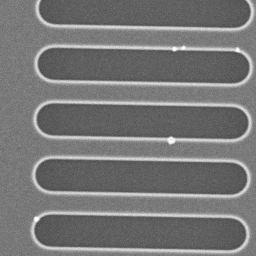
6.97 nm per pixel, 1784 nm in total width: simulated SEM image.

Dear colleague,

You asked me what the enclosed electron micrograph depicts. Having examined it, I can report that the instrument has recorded groups of lines, slits or small figures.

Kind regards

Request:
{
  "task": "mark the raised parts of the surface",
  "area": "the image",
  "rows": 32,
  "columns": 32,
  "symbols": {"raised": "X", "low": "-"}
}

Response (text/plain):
XXXXX--------------------------X
XXXXX--------------------------X
XXXXX--------------------------X
XXXXXXXXXXXXXXXXXXXXXXX-------XX
XXXXXXXXXXXXXXXXXXXXXXXXXXXXXXXX
XXXXXXXXXXXXXXXXXXXXXXXXXXXXXXXX
XXXXX-------------------------XX
XXXXX--------------------------X
XXXXX--------------------------X
XXXXX--------------------------X
XXXXXXXXXXXXXXXXXXXXXX--------XX
XXXXXXXXXXXXXXXXXXXXXXXXXXXXXXXX
XXXXXXXXXXXXXXXXXXXXXXXXXXXXXXXX
XXXXX-------------------------XX
XXXXX--------------------------X
XXXXX--------------------------X
XXXXX--------------------------X
XXXXXXXXXXXXXXXXXXXXXXXXXXX--XXX
XXXXXXXXXXXXXXXXXXXXXXXXXXXXXXXX
XXXXXXXXXXXXXXXXXXXXXXXXXXXXXXXX
XXXXX-------------------------XX
XXXX---------------------------X
XXXX---------------------------X
XXXXX--------------------------X
XXXXXXXXXXXXXXXXXXXXXXXXXXXXXXXX
XXXXXXXXXXXXXXXXXXXXXXXXXXXXXXXX
XXXXXXXXXXXXXXXXXXXXXXXXXXXXXXXX
XXXXX-------------------------XX
XXXX---------------------------X
XXXX---------------------------X
XXXXX-------------------------XX
XXXXXXXXXXXXXXXXXXXXXXXXXXXXXXXX